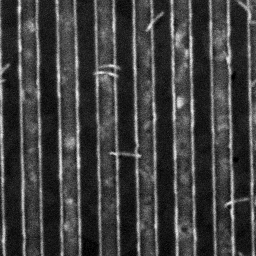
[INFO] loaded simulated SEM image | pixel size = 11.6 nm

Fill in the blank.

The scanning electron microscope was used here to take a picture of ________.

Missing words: parallel lines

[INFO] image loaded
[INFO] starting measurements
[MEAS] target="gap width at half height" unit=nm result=199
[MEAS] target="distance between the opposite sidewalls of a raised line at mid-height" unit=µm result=0.242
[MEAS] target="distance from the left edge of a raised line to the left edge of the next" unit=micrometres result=0.444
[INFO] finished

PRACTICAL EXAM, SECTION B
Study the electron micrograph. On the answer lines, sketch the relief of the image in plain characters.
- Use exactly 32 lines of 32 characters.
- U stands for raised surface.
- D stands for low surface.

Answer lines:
UUDDDUUDDUUUDDUUUDDUUUDDUUDDDUUD
UUDDDUUDDUUUDDUUUDDUUUDDUUDDDUUD
UUDDDUUDDUUUDDUUUDDUUUDDUUDDDUUD
UUDDUUUDDUUUDDUUUDDUUUDDUUDDDUUD
UUDDDUUDDUUUDDUUUDDUUUUDUUDDDUUD
UUUDDUUDDDUUDDUUUDDUUUDDUUDDDUUD
UUUDDUUDDDUUDDUUUDDUUUDDUUDDDUUD
UUUDDUUDDDUUDDUUUDDUUUDDUUDDDUUD
UUUDDUUDDDUUDDUUUDDUUUDDUUDDDUUD
UUUDDUUDDDUUDDUUUDDUUUDDUUDDDUUD
UUUDDUUDDDUUDDUUUDDUUUDDUUUDDUUD
UUUDDUUDDDUUDDUUUDDUUUDDUUUDDUUD
UUUDDUUDDDUUDDUUUDDUUUUDUUUDDUUD
UUUDDUUDDDUUDDUUUDDUUUDDUUUDDUUD
UUUDDUUDDDUUDDUUUDDUUUDDUUUDDUUD
UUUDDUUUDDUUDDDUUDDUUUDDUUUDDUUD
UUUDDUUUDDUUDDDUUDDUUUDDUUUDDUUD
UUUDDUUUDDUUDDDUUDDUUUDDUUUDDUUD
UUUDDUUUDDUUDDDUUDDUUUDDUUUDDUUU
UUUDDUUUDDUUDDUUUDDUUUDDUUUDDUUD
UUUDDUUUDDUUDDDUUDDUUUDDUUUDDUUD
UUUDDUUUDDUUDDDUUDDUUUDDUUUDDUUD
UUUDDUUUDDUUUDDUUDDUUUDDUUUDDUUD
UUUDDUUUDDUUUDDUUDDUUUDDUUUDDUUU
UUUDDUUUDDUUDDDUUDDUUUDDUUUDDUUU
UUUDDUUUDDUUDDDUUDDUUUDDUUUDDUUU
UUUDDUUUDDUUDDDUUDDUUUDDUUUDDUUU
UUUDDUUUDDUUUDDUUDDUUUDDUUUDDUUU
UUUDDUUUDDUUUDDUUDDUUUDDUUUDDUUU
UUUDDUUUDDUUUDDUUDDDUUDDUUUDDUUU
UUUDDUUUDDUUUDDUUDDDUUDDUUUDDUUU
UUUDDUUUDDUUUDDUUDDDUUDDUUUDDUUU